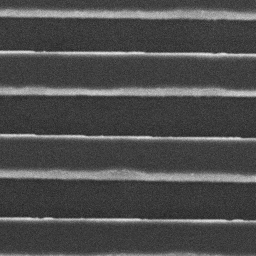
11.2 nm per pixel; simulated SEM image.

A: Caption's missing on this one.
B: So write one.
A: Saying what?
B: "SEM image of lines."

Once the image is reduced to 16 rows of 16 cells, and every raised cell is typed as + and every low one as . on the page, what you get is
++++++++++++++++
................
................
++++++++++++++++
++++++++++++++++
++++++++++++++++
................
................
+++++...........
++++++++++++++++
++++++++++++++++
................
................
................
++++++++++++++++
++++++++++++++++